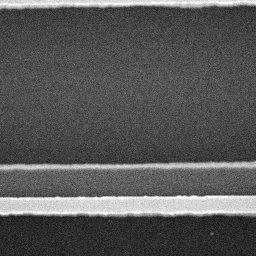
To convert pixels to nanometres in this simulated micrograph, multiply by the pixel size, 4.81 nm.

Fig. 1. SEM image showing lines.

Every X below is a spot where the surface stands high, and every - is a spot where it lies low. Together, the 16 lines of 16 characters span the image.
----------------
----------------
----------------
----------------
----------------
----------------
----------------
----------------
----------------
----------------
XXXXXXXXXXXXXXXX
XXXXXXXXXXXXXXXX
XXXXXXXXXXXXXXXX
----------------
----------------
----------------